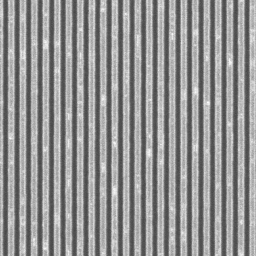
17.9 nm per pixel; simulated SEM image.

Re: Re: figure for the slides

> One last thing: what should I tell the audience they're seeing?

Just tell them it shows parallel lines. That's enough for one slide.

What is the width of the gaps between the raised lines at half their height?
0.0916 microns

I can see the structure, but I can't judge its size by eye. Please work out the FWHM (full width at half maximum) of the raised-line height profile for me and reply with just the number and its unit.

107 nanometres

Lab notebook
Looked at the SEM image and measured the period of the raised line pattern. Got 205 nanometers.